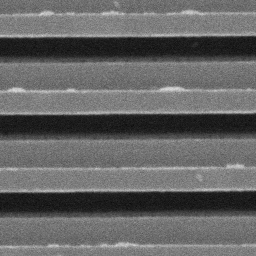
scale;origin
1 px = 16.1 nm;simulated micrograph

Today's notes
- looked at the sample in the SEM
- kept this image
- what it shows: lines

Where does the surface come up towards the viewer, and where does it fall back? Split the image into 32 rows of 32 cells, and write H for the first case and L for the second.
HHHHHHHHHHHHHHHHHHHHHHHHHHHHHHHH
HHHHHHHHHHHHHHHHHHHHHHHHHHHHHHHH
HHHHHHHHHHHHHHHHHHHHHHHHHHHHHHHH
HHHHHHHHHHHHHHHHHHHHHHHHHHHHHHHH
HHHHHHHHHHHHHHHHHHHHHHHHHLLLLLLL
LLLLLLLLLLLLLLLLLLLLLLLLLLLLLLLL
LLLLLLLLLLLLLLLLLLLLLLLLLLLLLLLL
LLLLLLLLLLLLLLLLLLLLLLLLLLLLLLLL
HHHHHHHHHHHHHHHHHHHHHHHHHHHHHHHH
HHHHHHHHHHHHHHHHHHHHHHHHHHHHHHHH
HHHHHHHHHHHHHHHHHHHHHHHHHHHHHHHH
HHHHHHHHHHHHHHHHHHHHHHHHHHHHHHHH
HHHHHHHHHHHHHHHHHHHHHHHHHHHHHHHH
HHHHHHHHHHHHHHHHHHHHHHHHHHHHHHHH
LLLLLLLLLLLLLLLLLLLLLLLLLLLLLLLL
LLLLLLLLLLLLLLLLLLLLLLLLLLLLLLLL
LLLLLLLLLLLLLLLLLLLLLLLLLLLLLLLL
LLLLLLLLLLLLHHHHHHHHHHHHHHHHHHHH
HHHHHHHHHHHHHHHHHHHHHHHHHHHHHHHH
HHHHHHHHHHHHHHHHHHHHHHHHHHHHHHHH
HHHHHHHHHHHHHHHHHHHHHHHHHHHHHHHH
HHHHHHHHHHHHHHHHHHHHHHHHHHHHHHHH
HHHHHHHHHHHHHHHHHHHHHHHHHHHHHHHH
HHHHHHHHHHHHHHHHHHHHHHHHHHHHHHHH
LLLLLLLLLLLLLLLLLLLLLLLLLLLLLLLL
LLLLLLLLLLLLLLLLLLLLLLLLLLLLLLLL
LLLLLLLLLLLLLLLLLLLLLLLLLLLLLLLL
HHHHHHHHHHHHHHHHHHHHHHHHHHHHHHHH
HHHHHHHHHHHHHHHHHHHHHHHHHHHHHHHH
HHHHHHHHHHHHHHHHHHHHHHHHHHHHHHHH
HHHHHHHHHHHHHHHHHHHHHHHHHHHHHHHH
HHHHHHHHHHHHHHHHHHHHHHHHHHHHHHHH